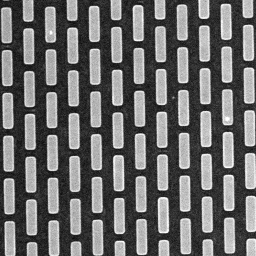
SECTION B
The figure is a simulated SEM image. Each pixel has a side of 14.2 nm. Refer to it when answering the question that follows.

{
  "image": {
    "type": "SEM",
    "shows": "groups of lines, slits or small figures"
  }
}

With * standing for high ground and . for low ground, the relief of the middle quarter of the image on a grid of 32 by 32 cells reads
.......**.........**........***.
.......**.........**...**...***.
.**....**...**....**...**....**.
.**....**...**....**...***...**.
.**....**...**....**...***...**.
.**.........**.........***......
.**.........**.........***......
.**....**...***...**...***...**.
.**....**...***...**...***...**.
.**....**...***...**...***...**.
.......**.........**.........**.
.......**.........**.........**.
.......**...**....**...***...**.
.***...**...***...**...***...**.
.***...**...***...**...***...**.
.***...**...***........***......
.***........***........***......
.***........***...**...***...**.
.***...**...***...**...***...**.
.***...**...***...**...***...**.
.***...**...***...**...***...**.
.......**.........**.........**.
.......**.........**.........**.
..**...**...***...**...***...**.
..**...**...***...**...***...**.
..**...**...***...**...***...**.
..**........***.........**......
..**........***.........**......
..**...**...***...**....**...**.
..**...**...***...**....**...**.
..**...**...***...**....**...**.
..**...**....**...**.........**.